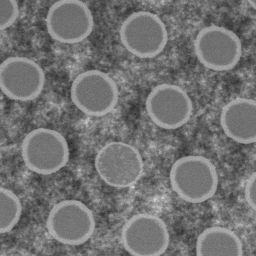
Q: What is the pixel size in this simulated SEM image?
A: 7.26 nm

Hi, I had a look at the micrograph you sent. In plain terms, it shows a regular array of raised bodies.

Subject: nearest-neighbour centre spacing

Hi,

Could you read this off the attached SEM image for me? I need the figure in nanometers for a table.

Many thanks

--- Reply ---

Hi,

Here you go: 546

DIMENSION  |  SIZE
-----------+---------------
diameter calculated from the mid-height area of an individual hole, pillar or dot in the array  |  306 nm